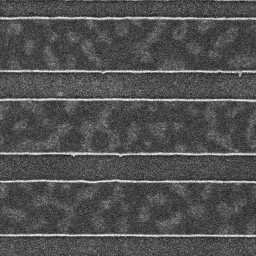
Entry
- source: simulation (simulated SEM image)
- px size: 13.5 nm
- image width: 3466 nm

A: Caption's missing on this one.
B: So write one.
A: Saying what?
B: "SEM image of one or a few lines or trenches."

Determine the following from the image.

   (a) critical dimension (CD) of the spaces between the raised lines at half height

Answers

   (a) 381 nanometers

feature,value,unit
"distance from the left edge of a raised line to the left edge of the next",1110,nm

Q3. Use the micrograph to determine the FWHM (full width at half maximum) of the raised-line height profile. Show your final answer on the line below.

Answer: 728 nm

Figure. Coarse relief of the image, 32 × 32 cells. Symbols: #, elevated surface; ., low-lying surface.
................................
................................
################################
################################
################################
################################
################################
################################
################################
................................
................................
................................
########........................
################################
################################
################################
################################
################################
################################
................................
................................
................................
................................
################################
################################
################################
################################
################################
################################
................................
................................
................................